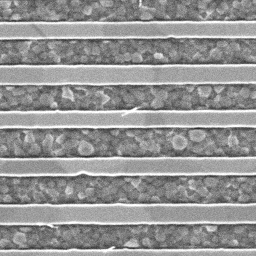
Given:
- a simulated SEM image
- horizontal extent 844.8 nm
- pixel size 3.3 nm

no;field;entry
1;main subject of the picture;parallel lines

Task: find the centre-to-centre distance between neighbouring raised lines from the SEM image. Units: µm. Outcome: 0.152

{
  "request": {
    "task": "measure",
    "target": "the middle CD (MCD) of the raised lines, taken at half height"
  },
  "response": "54.9 nanometers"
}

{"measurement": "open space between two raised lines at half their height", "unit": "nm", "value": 92.1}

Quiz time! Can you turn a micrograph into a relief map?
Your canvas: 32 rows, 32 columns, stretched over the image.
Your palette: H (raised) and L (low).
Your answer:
LLLLLLLLLLLLLLLLLLLLLLLLLLLLLLLL
LLLLLLLLLLLLLLLLLLLLLLLLLLLLLLLL
LLLLLLLLLLLLLLLLLLLLLLLLLLLLLLLL
HHHHHHHHHHHHHHHHHHHHHHHHHHHHHHHH
HHHHHHHHHHHHHHHHHHHHHHHHHHHHHHHH
LLLLLLLLLLLLLLLLLLLLLLLLLLLLLLLL
LLLLLLLLLLLLLLLLLLLLLLLLLLLLLLLL
LLLLLLLLLLLLLLLLLLLLLLLLLLLLLLLL
HHHHHHHHHHHHHHHHHHHHHHHHHHHHHHHH
HHHHHHHHHHHHHHHHHHHHHHHHHHHHHHHH
HHHHHHLLLLLHHHLLLLLHLLLLLLLLLLLL
LLLLLLLLLLLLLLLLLLLLLLLLLLLLLLLL
LLLLLLLLLLLLLLLLLLLLLLLLLLLLLLLL
LLLLLLLLLLLLLLLLLLLLLLLLLLLLLLLL
HHHHHHHHHHHHHHHHHHHHHHHHHHHHHHHH
HHHHHHHHHHHHHHHHHHHHHHHHHHHHHHHH
LLLLLLLLLLLLLLLLLLLLLLLLLLLLLLLL
LLLLLLLLLLLLLLLLLLLLLLLLLLLLLLLL
LLLLLLLLLLLLLLLLLLLLLLLLLLLLLLLL
LLLLLLLLLLLLLLLLLLLLLLLLLLLLLLLL
HHHHHHHHHHHHHHHHHHHHHHHHHHHHHHHH
HHHHHHHHHHHHHHHHHHHHHHHHHHHHHHHH
LLLLLLLLLLLLLLLLLLLLLLLLLLLLLLLL
LLLLLLLLLLLLLLLLLLLLLLLLLLLLLLLL
LLLLLLLLLLLLLLLLLLLLLLLLLLLLLLLL
LLLLLLLLLLLLLLLLLLLLLLLLLLLLLLLL
HHHHHHHHHHHHHHHHHHHHHHHHHHHHHHHH
HHHHHHHHHHHHHHHHHHHHHHHHHHHHHHHH
LLLLLLLLLLLLLLLLLLLLLLLLLLLLLLLL
LLLLLLLLLLLLLLLLLLLLLLLLLLLLLLLL
LLLLLLLLLLLLLLLLLLLLLLLLLLLLLLLL
HHHHHHHHHHHHHHHHHHHHHHHHHHHHHHHH